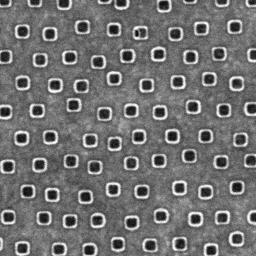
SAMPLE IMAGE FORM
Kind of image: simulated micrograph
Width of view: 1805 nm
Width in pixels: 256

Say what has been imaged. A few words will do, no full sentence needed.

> a regular array of raised bodies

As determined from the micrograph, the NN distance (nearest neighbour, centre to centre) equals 189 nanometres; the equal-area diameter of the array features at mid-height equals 101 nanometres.